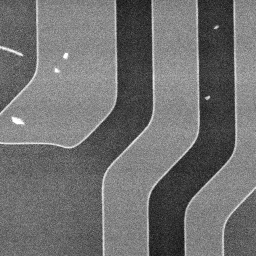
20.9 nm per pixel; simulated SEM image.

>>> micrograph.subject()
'groups of lines, slits or small figures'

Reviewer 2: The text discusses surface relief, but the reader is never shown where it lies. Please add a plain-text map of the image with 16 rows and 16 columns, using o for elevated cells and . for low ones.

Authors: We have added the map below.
..ooooo...oo...o
..ooooo...oo...o
..ooooo...oo...o
..ooooo...oo...o
..ooooo...oo...o
..ooooo...oo...o
.oooooo...oo...o
oooooo...ooo...o
oooooo...ooo...o
........oooo...o
.......oooo...oo
......oooo...ooo
......ooo...ooo.
......ooo...oo..
......ooo...oo..
......ooo...oo..